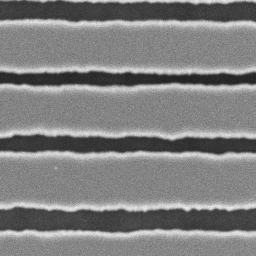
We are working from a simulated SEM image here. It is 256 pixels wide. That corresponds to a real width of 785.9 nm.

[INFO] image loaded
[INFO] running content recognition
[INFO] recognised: lines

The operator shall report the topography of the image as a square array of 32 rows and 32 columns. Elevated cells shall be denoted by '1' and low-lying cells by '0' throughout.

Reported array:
00000000000000000000000000000000
00000000000000000000000000000000
00011000000000000000000000000000
11111111111111111111111111111111
11111111111111111111111111111111
11111111111111111111111111111111
11111111111111111111111111111111
11111111111111111111111111111111
11111111111111111111111111111111
00000000000000000000000000000000
11000000000000000000111100000010
11111111111111111111111111111111
11111111111111111111111111111111
11111111111111111111111111111111
11111111111111111111111111111111
11111111111111111111111111111111
11111111111111111111111111111111
00000000000000000000000000000000
00000000000000000000000000000000
11111111111111111111111111111111
11111111111111111111111111111111
11111111111111111111111111111111
11111111111111111111111111111111
11111111111111111111111111111111
11111111111111111111111111111111
11111111111111111111111111111111
00000000000000000000000000000000
00000000000000000000000000000000
00000000000000000000000000000000
11111111111111111111111111111111
11111111111111111111111111111111
11111111111111111111111111111111